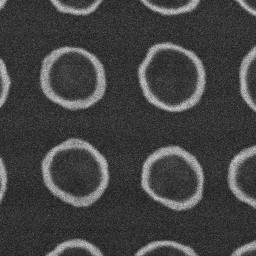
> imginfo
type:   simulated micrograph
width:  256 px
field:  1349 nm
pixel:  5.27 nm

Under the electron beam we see raised bodies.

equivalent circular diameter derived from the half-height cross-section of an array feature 310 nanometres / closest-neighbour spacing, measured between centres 96.3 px